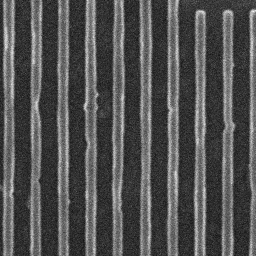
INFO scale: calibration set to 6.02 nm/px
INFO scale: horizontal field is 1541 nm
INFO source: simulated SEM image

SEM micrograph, parallel lines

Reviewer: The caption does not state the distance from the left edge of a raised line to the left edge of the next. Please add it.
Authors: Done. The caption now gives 165 nm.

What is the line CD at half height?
53.5 nm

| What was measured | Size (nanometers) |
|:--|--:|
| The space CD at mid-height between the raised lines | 113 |